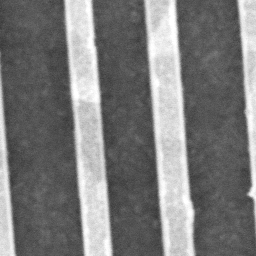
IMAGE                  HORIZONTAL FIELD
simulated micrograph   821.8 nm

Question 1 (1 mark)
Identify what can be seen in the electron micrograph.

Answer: one or a few lines or trenches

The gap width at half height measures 220 nm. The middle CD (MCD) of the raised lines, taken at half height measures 77.3 nm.